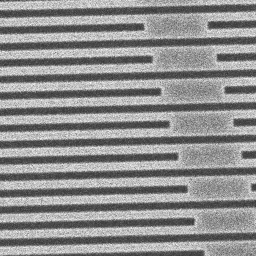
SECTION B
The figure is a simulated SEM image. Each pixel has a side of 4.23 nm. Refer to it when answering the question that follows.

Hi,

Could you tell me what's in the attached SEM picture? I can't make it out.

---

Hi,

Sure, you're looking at parallel lines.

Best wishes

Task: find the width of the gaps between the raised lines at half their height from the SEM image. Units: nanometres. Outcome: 31.7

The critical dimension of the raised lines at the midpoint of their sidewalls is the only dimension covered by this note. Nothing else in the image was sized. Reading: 8.49 pixels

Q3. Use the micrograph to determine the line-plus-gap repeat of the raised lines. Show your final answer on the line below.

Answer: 69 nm